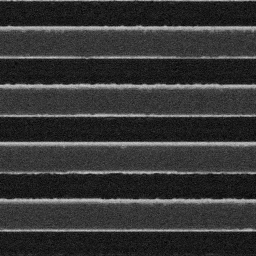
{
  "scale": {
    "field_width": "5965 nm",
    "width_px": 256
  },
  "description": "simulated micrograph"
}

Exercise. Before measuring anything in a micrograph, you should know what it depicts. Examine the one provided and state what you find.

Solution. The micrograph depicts lines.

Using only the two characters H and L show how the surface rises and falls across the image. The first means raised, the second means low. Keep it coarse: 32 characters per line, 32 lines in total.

LLLLLLLLLLLLLLLLLLLLLLLLLLLLLLLL
LLLLLLLLLLLLLLLLLLLLLLLLLLLLLLLL
LLLLLLLLLLLLLLLLLLLLLLLLLLLLLLLL
HHHHHHHHHHHHHHHHHHHHHHHHHHHHHHHH
HHHHHHHHHHHHHHHHHHHHHHHHHHHHHHHH
HHHHHHHHHHHHHHHHHHHHHHHHHHHHHHHH
HHHHHHHHHHHHHHHHHHHHHHHHHHHHHHHH
LLLLLLLLLLLLLLLLLLLLLLLLLLLLLLLL
LLLLLLLLLLLLLLLLLLLLLLLLLLLLLLLL
LLLLLLLLLLLLLLLLLLLLLLLLLLLLLLLL
LLLLLLLLLLLLLLLLLLLLLLLLLLLLLLLL
HHHHHHHHHHHHHHHHHHHHHHHHHHHHHHHH
HHHHHHHHHHHHHHHHHHHHHHHHHHHHHHHH
HHHHHHHHHHHHHHHHHHHHHHHHHHHHHHHH
HHHHHHLHLHLHLLHLLLLHHHHHHHHHHHHL
LLLLLLLLLLLLLLLLLLLLLLLLLLLLLLLL
LLLLLLLLLLLLLLLLLLLLLLLLLLLLLLLL
LLLLLLLLLLLLLLLLLLLLLLLLLLLLLLLL
HHHHHHHHHHHHHHHHHHHHHHHHHHHHHHHH
HHHHHHHHHHHHHHHHHHHHHHHHHHHHHHHH
HHHHHHHHHHHHHHHHHHHHHHHHHHHHHHHH
HHHHHHHHHHHHHHHHHHHHHHHHHHHHHHHH
LLLLLLLLLLLLLLLLLLLLLLLLLLLLLLLL
LLLLLLLLLLLLLLLLLLLLLLLLLLLLLLLL
LLLLLLLLLLLLLLLLLLLLLLLLLLLLLLLL
HHHHHHHHHHHHHHHHHHHHHHHHHHHHHHHH
HHHHHHHHHHHHHHHHHHHHHHHHHHHHHHHH
HHHHHHHHHHHHHHHHHHHHHHHHHHHHHHHH
HHHHHHHHHHHHHHHHHHHHHHHHHHHHHHHH
LLLLLLLLLLLLLLLLLLLLLLLLLLLLLLLL
LLLLLLLLLLLLLLLLLLLLLLLLLLLLLLLL
LLLLLLLLLLLLLLLLLLLLLLLLLLLLLLLL